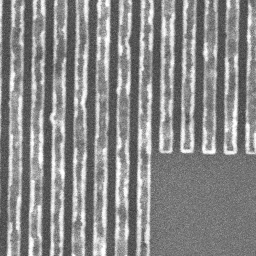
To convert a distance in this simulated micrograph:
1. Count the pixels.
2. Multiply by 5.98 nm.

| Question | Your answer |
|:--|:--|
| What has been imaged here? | parallel lines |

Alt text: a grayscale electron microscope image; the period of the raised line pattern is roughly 128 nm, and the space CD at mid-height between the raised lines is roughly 58.3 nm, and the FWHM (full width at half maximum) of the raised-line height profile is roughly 70.3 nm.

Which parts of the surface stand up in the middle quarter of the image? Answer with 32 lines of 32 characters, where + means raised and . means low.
...+++..+++...++...+++..+++...++
...+++..+++...++...+++..+++...++
...+++..+++...++...+++..+++...++
...+++..+++...++...+++..+++...++
...+++..+++...++...+++..+++...++
...+++..+++...++...+++..+++...++
...+++..+++..+++...+++..+++...++
...+++..+++..+++...+++..+++...++
...++...+++...++...+++..+++...++
...++...+++...++...+++..+++...++
...++...+++...++...+++..+++...++
...++...+++...++...+++..+++...++
...++...+++...++...+++...++...++
...++...+++...++...+++..+++...++
...++...+++..+++...+++..+++...++
...++...+++..+++...+++..+++...++
...++...+++..+++...+++..+++...++
...++...+++..+++...+++..+++...++
...++...+++..+++...++...+++...++
...++...+++..+++...++...+++..+++
...++...+++..+++...++...+++..+++
...++...+++..+++...++...+++..+++
...++...+++..+++...++...........
...++...+++..+++...++...........
...++...+++..+++...++...........
...++...+++..+++...++...........
...++...+++..+++...++...........
...++...+++..+++...++...........
...++...+++..+++...++...........
..+++...+++..+++...++...........
..+++...+++..+++...++...........
...++...+++..+++...++...........